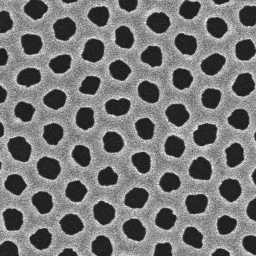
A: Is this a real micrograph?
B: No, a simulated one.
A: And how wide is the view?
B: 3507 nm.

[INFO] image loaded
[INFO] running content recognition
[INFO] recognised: a regular array of holes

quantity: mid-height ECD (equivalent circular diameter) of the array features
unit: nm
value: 295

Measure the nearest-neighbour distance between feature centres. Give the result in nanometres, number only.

460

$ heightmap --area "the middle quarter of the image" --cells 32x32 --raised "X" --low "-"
--XXXXXXXXX-----XXXXXX--XXXXXXXX
-XXXXXXXXXX------XXXXXXXXXXX---X
XXXXXXXXXXX------XXXXXXXXXX-----
XXXXX----XXX----XXXXXXXXXXX-----
XXXX-----XXXXXXXXXX--XXXXXX-----
XXXX-----XXXXXXXXXX----XXXXX----
XXXX----XXXXXXXXXX------XXXXXXXX
XXXXX---XXXXXXXXXXX-----XXXXXXXX
-XXXXXXXXXXXXXXXXXX-----XXXXXXXX
XXXXXXXXXXX------XXXX--XXXXXXXXX
XXXXXXXXXX-------XXXXXXXXX----XX
XXXX---XXX------XXXXXXXXXX-----X
XXX----XXXX-----XXXXXXXXX------X
XXX----XXXXXXXXXXXXX-XXXXX-----X
XXX-----XXXXXXXXXX----XXXXX---XX
XXX----XXXXXXXXXXX-----XXXXX-XXX
XXXXX-XXXXXXXXXXXX-----XXXXXXXXX
XXXXXXXXXX----XXXX-----XXXXXXXXX
XXXXXXXXXX-----XXXX---XXXX---XXX
XXXXXXXXXX-----XXXXXXXXXX-----XX
XXX--XXXXX-----XXXXXXXXXX-----XX
XX----XXXX----XXXXXXXXXXX-----XX
XX----XXXXXXXXXXX----XXXXX----XX
XX-----XXXXXXXXXX-----XXXXXXXXXX
XXX----XXXXXXXXXX-----XXXXXXXXXX
XXXX--XXXXXXXXXXXX----XXXXXXXXX-
XXXXXXXXX---XXXXXX---XXXXXXXXXX-
XXXXXXXX-----XXXXXXXXXXXX---XXX-
XXXXXXXX------XXXXXXXXXX-----XXX
XX--XXXXX----XXXXXXXXXXX-----XXX
X----XXXXXXXXXXXXXXXXXXX-----XXX
------XXXXXXXXXXX---XXXXX---XXXX